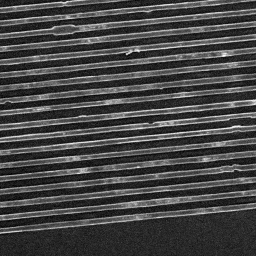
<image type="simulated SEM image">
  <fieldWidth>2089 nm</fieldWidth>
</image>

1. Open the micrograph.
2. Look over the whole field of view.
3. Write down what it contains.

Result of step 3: parallel lines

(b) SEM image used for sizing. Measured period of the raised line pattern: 105 nm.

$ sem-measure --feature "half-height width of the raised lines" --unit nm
42.6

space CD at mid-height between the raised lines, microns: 0.0639